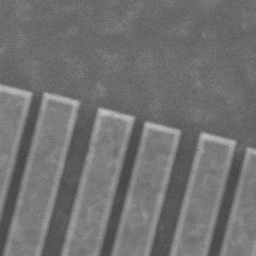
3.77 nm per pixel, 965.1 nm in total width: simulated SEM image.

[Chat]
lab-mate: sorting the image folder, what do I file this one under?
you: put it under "parallel lines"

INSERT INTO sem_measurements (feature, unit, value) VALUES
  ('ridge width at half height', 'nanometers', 127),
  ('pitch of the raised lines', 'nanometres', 200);